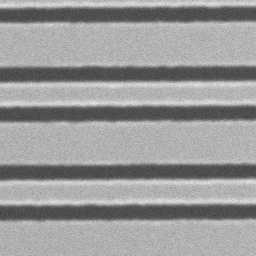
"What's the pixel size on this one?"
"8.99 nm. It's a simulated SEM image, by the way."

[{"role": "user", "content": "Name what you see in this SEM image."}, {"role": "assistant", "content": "lines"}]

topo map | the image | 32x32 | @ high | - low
@@@@@@@@@@@@@@@@@@@@@@@@@@@@@@@@
--------------------------------
--------------------------------
@@@@@@@@@@@@@@@@@@@@@@@@@@@@@@@@
@@@@@@@@@@@@@@@@@@@@@@@@@@@@@@@@
@@@@@@@@@@@@@@@@@@@@@@@@@@@@@@@@
@@@@@@@@@@@@@@@@@@@@@@@@@@@@@@@@
@@@@@@@@@@@@@@@@@@@@@@@@@@@@@@@@
--------------------------------
--------------------------------
@@@@@@@@@@@@@@@@@@@@@@@@@@@@@@@@
@@@@@@@@@@@@@@@@@@@@@@@@@@@@@@@@
@@@@@@@@@@@@@@@@@@@@@@@@@@@@@@@@
--------------------------------
--------------------------------
@@@@@@@@@@@@@@@@@@@@@@@@@@@@@@@@
@@@@@@@@@@@@@@@@@@@@@@@@@@@@@@@@
@@@@@@@@@@@@@@@@@@@@@@@@@@@@@@@@
@@@@@@@@@@@@@@@@@@@@@@@@@@@@@@@@
@@@@@@@@@@@@@@@@@@@@@@@@@@@@@@@@
@@@@@@@@@@@@@@@@@---------------
--------------------------------
------------------@@-@@@-@@@@@@@
@@@@@@@@@@@@@@@@@@@@@@@@@@@@@@@@
@@@@@@@@@@@@@@@@@@@@@@@@@@@@@@@@
@@@@@@@@@@---@@@-@--------------
--------------------------------
-------------------------------@
@@@@@@@@@@@@@@@@@@@@@@@@@@@@@@@@
@@@@@@@@@@@@@@@@@@@@@@@@@@@@@@@@
@@@@@@@@@@@@@@@@@@@@@@@@@@@@@@@@
@@@@@@@@@@@@@@@@@@@@@@@@@@@@@@@@